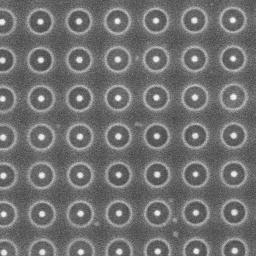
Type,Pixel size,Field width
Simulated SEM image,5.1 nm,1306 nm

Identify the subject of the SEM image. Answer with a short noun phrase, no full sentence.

an array of small figures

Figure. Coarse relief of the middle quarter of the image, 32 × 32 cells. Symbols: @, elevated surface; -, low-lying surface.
@-----@@@@@-----@@@@@----@@@@@--
@@@--@@@@@@@---@@@@@@@--@@@@@@@@
@@@@@@@@@@@@@@@@@@@@@@@@@@@@@@@@
@@@@@@@@@@@@@@@@@@@@@@@@@@@@@@@@
@@@@@@@@@@@@@@@@@@@@@@@@@@@@@@@@
@@@@@@@@@@@@@@@@@@@@@@@@@@@@@@@@
@@----@@@@@-----@@@@@----@@@@@--
@------@@@@-----@@@@------@@@@--
@--@---@@@---@---@@@---@--@@@@--
@------@@@@-----@@@@------@@@@--
@-----@@@@@-----@@@@@----@@@@@@-
@@@@@@@@@@@@@@@@@@@@@@@@@@@@@@@@
@@@@@@@@@@@@@@@@@@@@@@@@@@@@@@@@
@@@@@@@@@@@@@@@@@@@@@@@@@@@@@@@@
@@@@@@@@@@@@@@@@@@@@@@@@@@@@@@@@
@@---@@@@@@@---@@@@@@@---@@@@@@-
@@----@@@@@-----@@@@@-----@@@@--
@------@@@@-----@@@@------@@@@--
@------@@@@--@---@@@------@@@@--
@------@@@@-----@@@@@-----@@@@--
@@----@@@@@@---@@@@@@@---@@@@@@-
@@@@@@@@@@@@@@@@@@@@@@@@@@@@@@@@
@@@@@@@@@@@@@@@@@@@@@@@@@@@@@@@@
@@@@@@@@@@@@@@@@@@@@@@@@@@@@@@@@
@@@@@@@@@@@@@@@@@@@@@@@@@@@@@@@@
@@----@@@@@@---@@@@@@----@@@@@@-
@------@@@@-----@@@@@-----@@@@--
@------@@@@--@---@@@---@--@@@@--
@------@@@@-----@@@@@-----@@@@--
@@----@@@@@-----@@@@@-----@@@@@-
@@@--@@@@@@@@-@@@@@@@@@-@@@@@@@@
@@@@@@@@@@@@@@@@@@@@@@@@@@@@@@@@